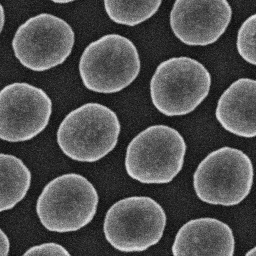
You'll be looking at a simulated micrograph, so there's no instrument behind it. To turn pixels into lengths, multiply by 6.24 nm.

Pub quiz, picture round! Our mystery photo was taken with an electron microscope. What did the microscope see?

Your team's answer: a regular array of raised bodies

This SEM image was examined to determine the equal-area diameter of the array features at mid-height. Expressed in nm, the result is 359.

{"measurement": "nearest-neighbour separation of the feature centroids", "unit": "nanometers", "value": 439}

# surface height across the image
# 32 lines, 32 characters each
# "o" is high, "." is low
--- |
.............ooooooo..oooooo....
.............oooooo..oooooooo...
....oooo......oooo...oooooooo..o
...oooooo.............oooooo..oo
..ooooooo.....o.......ooooo...oo
..ooooooo...oooo........oo....oo
..ooooooo..oooooo.............oo
..oooooo..ooooooo....ooo.......o
....oo....ooooooo...ooooo.......
..........ooooooo..ooooooo......
..o........ooooo...ooooooo...ooo
ooooo........o.....ooooooo..oooo
oooooo.............oooooo..ooooo
oooooo....ooo.......oooo...ooooo
oooooo...ooooo.............ooooo
oooooo..ooooooo.............oooo
ooooo..oooooooo...oooo.......ooo
.oo....oooooooo..oooooo.........
........oooooo..ooooooo.........
o........oooo...ooooooo...ooooo.
ooo.............ooooooo..oooooo.
ooo.............oooooo...oooooo.
oooo...oooo......oooo...ooooooo.
ooo...oooooo............ooooooo.
ooo..ooooooo.............oooooo.
oo...ooooooo..oooooo.......oo...
.....ooooooo..oooooo............
.....oooooo..oooooooo...ooo.....
......oooo...ooooooo...ooooo....
o............ooooooo..ooooooo...
o.....o.......ooooo...ooooooo...
o..ooooo..............ooooooo..o